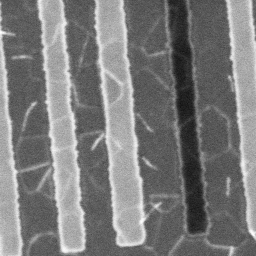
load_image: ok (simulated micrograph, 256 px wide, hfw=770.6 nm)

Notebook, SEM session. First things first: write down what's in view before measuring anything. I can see parallel lines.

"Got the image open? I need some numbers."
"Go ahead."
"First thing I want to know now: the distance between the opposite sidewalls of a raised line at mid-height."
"0.0734 um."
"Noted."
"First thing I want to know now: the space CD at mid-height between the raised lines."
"0.117 microns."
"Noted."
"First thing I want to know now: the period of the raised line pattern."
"187 nm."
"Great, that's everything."